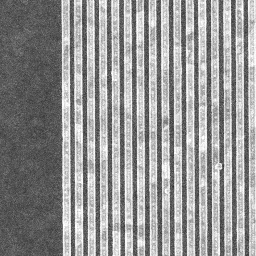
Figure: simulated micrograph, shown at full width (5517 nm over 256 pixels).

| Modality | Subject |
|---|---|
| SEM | parallel lines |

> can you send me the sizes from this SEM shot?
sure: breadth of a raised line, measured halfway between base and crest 6.62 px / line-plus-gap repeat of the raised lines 0.268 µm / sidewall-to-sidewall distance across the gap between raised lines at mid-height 124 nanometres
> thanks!